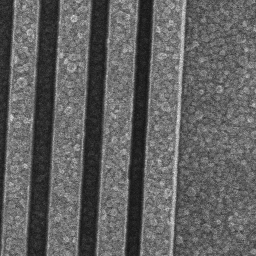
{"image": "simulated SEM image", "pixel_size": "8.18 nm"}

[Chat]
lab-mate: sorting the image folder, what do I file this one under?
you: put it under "parallel lines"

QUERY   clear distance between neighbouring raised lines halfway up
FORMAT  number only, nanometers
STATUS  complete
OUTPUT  142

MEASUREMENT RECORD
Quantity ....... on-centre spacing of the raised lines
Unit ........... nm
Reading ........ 386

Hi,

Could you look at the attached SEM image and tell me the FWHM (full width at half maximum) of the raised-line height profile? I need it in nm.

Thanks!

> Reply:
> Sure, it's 252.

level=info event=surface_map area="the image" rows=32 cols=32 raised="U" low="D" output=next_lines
DDUUUDDDUUUDDDUUUDDUUUUDDDDDDDDD
DDUUUDDUUUUDDDUUUDDUUUUDDDDDDDDD
DDUUUDDUUUUDDDUUUDDUUUUDDDDDDDDD
DDUUUDDUUUUDDUUUUDDUUUUDDDDDDDDD
DDUUUDDUUUUDDUUUUDDUUUUDDDDDDDDD
DDUUUDDUUUUDDUUUUDDUUUUDDDDDDDDD
DUUUUDDUUUUDDUUUUDDUUUUDDDDDDDDD
DUUUUDDUUUUDDUUUUDDUUUUDDDDDDDDD
DUUUUDDUUUUDDUUUUDDUUUUDDDDDDDDD
DUUUUDDUUUUDDUUUUDDUUUUDDDDDDDDD
DUUUDDDUUUUDDUUUUDDUUUUDDDDDDDDD
DUUUDDDUUUUDDUUUUDDUUUDDDDDDDDDD
DUUUDDDUUUUDDUUUUDUUUUDDDDDDDDDD
DUUUDDDUUUUDDUUUUDUUUUDDDDDDDDDD
DUUUDDDUUUUDDUUUUDUUUUDDDDDDDDDD
DUUUDDDUUUUDDUUUUDUUUUDDDDDDDDDD
DUUUDDDUUUUDDUUUDDUUUUDDDDDDDDDD
DUUUDDDUUUUDDUUUDDUUUUDDDDDDDDDD
DUUUDDUUUUDDDUUUDDUUUUDDDDDDDDDD
DUUUDDUUUUDDDUUUDDUUUUDDDDDDDDDD
DUUUDDUUUUDDDUUUDDUUUUDDDDDDDDDD
DUUUDDUUUUDDDUUUDDUUUUDDDDDDDDDD
DUUUDDUUUUDDUUUUDDUUUUDDDDDDDDDD
DUUUDDUUUUDDUUUUDDUUUUDDDDDDDDDD
UUUUDDUUUUDDUUUUDDUUUUDDDDDDDDDD
UUUUDDUUUUDDUUUUDDUUUUDDDDDDDDDD
UUUUDDUUUUDDUUUUDDUUUUDDDDDDDDDD
UUUUDDUUUUDDUUUUDDUUUUDDDDDDDDDD
UUUDDDUUUUDDUUUUDDUUUUDDDDDDDDDD
UUUDDDUUUUDDUUUUDDUUUUDDDDDDDDDD
UUUDDDUUUUDDUUUUDDUUUDDDDDDDDDDD
UUUDDDUUUUDDUUUUDUUUUDDDDDDDDDDD